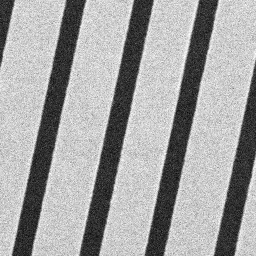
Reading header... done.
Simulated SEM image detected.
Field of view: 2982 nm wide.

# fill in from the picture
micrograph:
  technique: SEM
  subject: lines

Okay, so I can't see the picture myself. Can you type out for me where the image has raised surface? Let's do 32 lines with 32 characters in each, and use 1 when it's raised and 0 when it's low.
00111111000111111001111110011111
00111111001111110001111110011111
01111111001111110001111100011111
01111110001111110001111100011111
01111110001111110011111100111111
01111110001111110011111100111111
11111110011111100011111000111111
11111110011111100011111000111111
11111100011111100111111000111111
11111100011111100111111001111111
11111100011111000111111001111110
11111100111111000111110001111110
11111100111111000111110001111110
11111000111111001111110001111110
11111000111111001111110011111100
11111001111110001111110011111100
11111001111110001111100011111100
11111001111110011111100011111100
11110001111110011111100111111100
11110001111110011111100111111000
11110011111100011111000111111000
11110011111100011111000111111000
11100011111100111111000111111001
11100011111100111111001111110001
11100011111000111111001111110001
11100111111000111110001111110001
11100111111000111110001111110011
11000111111001111110011111110011
11000111111001111110011111100011
11001111110001111110011111100011
11001111110001111100011111100011
10001111110001111100011111100111